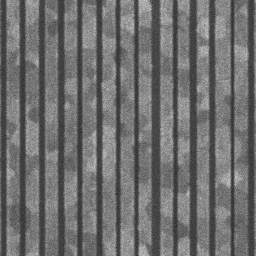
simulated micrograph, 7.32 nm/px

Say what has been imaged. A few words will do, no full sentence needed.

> parallel lines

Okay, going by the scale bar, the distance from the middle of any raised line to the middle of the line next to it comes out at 139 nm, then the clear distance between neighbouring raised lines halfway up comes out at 48.5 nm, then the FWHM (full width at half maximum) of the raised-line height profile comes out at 12.5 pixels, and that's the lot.